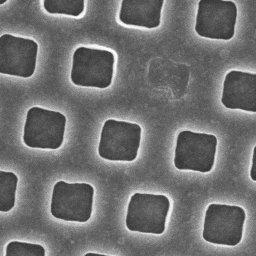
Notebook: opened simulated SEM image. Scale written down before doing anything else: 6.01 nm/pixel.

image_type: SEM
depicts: holes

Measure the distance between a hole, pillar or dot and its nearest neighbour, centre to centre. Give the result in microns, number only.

0.46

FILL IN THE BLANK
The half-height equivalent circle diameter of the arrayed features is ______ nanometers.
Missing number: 262